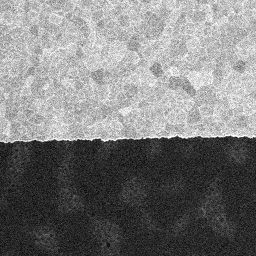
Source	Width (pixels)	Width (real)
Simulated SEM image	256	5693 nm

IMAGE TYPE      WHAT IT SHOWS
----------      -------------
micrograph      one or a few lines or trenches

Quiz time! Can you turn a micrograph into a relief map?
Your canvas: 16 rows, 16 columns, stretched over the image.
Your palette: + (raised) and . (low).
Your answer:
++++++++++++++++
++++++++++++++++
++++++++++++++++
++++++++++++++++
++++++++++++++++
++++++++++++++++
++++++++++++++++
++++++++++++++++
++++++++++++++.+
................
................
................
................
................
................
................